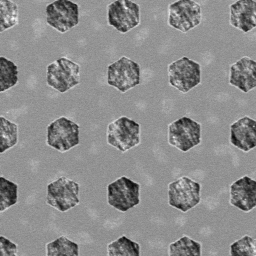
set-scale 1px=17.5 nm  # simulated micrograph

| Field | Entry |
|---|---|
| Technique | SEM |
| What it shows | a regular array of holes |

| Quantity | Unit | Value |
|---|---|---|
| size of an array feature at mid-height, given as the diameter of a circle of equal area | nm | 584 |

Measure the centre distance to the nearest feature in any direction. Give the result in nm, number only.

1050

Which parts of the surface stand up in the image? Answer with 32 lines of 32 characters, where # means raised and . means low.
..####...#####...#####...####...
..####....###.....###....####...
..####....###.....###....####...
.######..#####...#####..######..
################################
################################
################################
.######..######.######..######..
..####....####....###....####...
..####....###.....###....####...
..####....####...####....####...
################################
################################
################################
################################
..####....####...####....####...
..####....###.....###....####...
..####....###....####....####...
.######..######.######..######..
################################
################################
################################
.######..######.######..######..
..####....###.....###....####...
..####....###.....###....####...
..####....####...####....####...
################################
################################
################################
################################
..####...#####...####....####...
..####....###.....###....####...